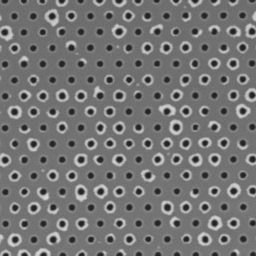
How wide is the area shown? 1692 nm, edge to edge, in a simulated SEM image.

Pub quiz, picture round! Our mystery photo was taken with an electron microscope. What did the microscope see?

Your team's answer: a regular array of holes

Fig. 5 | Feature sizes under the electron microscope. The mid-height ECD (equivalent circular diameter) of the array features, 42.2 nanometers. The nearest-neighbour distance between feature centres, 121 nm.